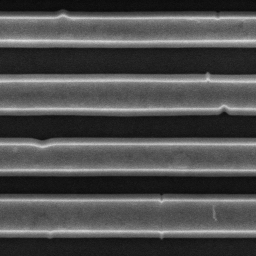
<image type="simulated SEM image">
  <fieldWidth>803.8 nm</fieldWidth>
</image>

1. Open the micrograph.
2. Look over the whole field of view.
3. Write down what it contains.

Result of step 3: one or a few lines or trenches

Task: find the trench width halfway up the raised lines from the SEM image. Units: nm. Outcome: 92.8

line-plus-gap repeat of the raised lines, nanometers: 196